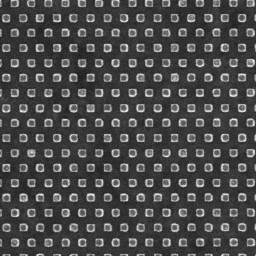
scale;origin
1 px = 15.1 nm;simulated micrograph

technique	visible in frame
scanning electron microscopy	a regular array of raised bodies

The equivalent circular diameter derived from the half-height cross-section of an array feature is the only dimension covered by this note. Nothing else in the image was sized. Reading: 7.98 pixels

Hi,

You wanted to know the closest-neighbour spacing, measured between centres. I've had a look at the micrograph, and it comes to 251 nm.